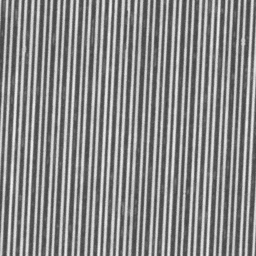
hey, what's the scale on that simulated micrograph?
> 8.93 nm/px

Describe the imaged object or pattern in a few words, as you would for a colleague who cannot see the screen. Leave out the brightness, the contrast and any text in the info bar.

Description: parallel lines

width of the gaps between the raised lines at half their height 34.6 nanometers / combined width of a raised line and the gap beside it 57.5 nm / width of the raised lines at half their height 16.7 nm